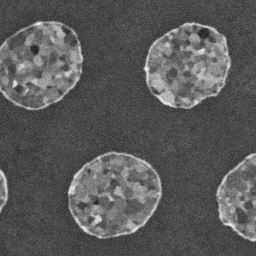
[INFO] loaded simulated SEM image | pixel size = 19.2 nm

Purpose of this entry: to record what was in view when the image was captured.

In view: raised bodies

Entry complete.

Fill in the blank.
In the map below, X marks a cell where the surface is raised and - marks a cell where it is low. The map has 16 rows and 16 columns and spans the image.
----------------
--XX------------
-XXXX-----XXXX--
XXXXX----XXXXX--
XXXXX----XXXXX--
XXXX-----XXXXX--
-XX--------X----
----------------
----------------
----------------
-----XXXX------X
-----XXXXX----XX
----XXXXXX----XX
-----XXXX-----XX
------XX-------X
----------------